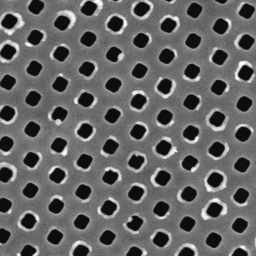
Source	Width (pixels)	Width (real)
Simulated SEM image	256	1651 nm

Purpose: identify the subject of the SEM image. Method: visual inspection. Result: a regular array of holes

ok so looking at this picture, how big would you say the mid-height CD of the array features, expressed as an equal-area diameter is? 96.3 nanometers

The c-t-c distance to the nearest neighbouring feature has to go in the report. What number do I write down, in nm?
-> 193